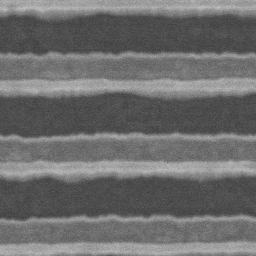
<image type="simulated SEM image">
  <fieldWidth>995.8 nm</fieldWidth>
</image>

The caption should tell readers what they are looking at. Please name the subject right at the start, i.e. lines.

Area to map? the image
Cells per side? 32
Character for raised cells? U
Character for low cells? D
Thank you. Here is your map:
UUUUUUUUUUUUUUUUUUUUUUUUUUUUUUUU
DDDDDUDDDDDDDDDDDDDDDDDDDDDDDDDD
DDDDDDDDDDDDDDDDDDDDDDDDDDDDDDDD
DDDDDDDDDDDDDDDDDDDDDDDDDDDDDDDD
DDDDDDDDDDDDDDDDDDDDDDDDDDDDDDDD
DDDDDDDDDDDDDDDDDDDDDDDDDDDDDDDD
DDDDDDDDDDDDDDDDDDDDDDDDDDDDDDDD
UUUUUUUUUUUUUUUUUUUUUUUUUUUUUUUU
UUUUUUUUUUUUUUUUUUUUUUUUUUUUUUUU
UUUUUUUUUUUUUUUUUUUUUUUUUUUUUUUU
UUUUUUUUUUUUUUUUUUUUUUUUUUUUUUUU
UUUUUUUUUUDDDDDDDDUUUUUUUUUDDUUD
DDDDDDDDDDDDDDDDDDDDDDDDDDDDDDDD
DDDDDDDDDDDDDDDDDDDDDDDDDDDDDDDD
DDDDDDDDDDDDDDDDDDDDDDDDDDDDDDDD
DDDDDDDDDDDDDDDDDDDDDDDDDDDDDDDD
DDDDDDDDDDDDDDDDDDDDDDDDDDDDDDDD
UUUUUUUUUUUUUUUUUUUUUUUUUUUUUUUU
UUUUUUUUUUUUUUUUUUUUUUUUUUUUUUUU
UUUUUUUUUUUUUUUUUUUUUUUUUUUUUUUU
UUUUUUUUUUUUUUUUUUUUUUUUUUUUUUUU
UUUUUUUUUUUUUUUUUUUUUUUUUUUUUUUU
DDDDDDDDDDDDDDDDDDDDDDDDDDDDDDDD
DDDDDDDDDDDDDDDDDDDDDDDDDDDDDDDD
DDDDDDDDDDDDDDDDDDDDDDDDDDDDDDDD
DDDDDDDDDDDDDDDDDDDDDDDDDDDDDDDD
DDDDDDDDDDDDDDDDDDDDDDDDDDDDDDDD
UDDDUUUUUUUUUUUUUUUUUUUUUUUUUUUU
UUUUUUUUUUUUUUUUUUUUUUUUUUUUUUUU
UUUUUUUUUUUUUUUUUUUUUUUUUUUUUUUU
UUUUUUUUUUUUUUUUUUUUUUUUUUUUUUUU
UUUUUUUUUUUUUUUUUUUUUUUUUUUUUUUU